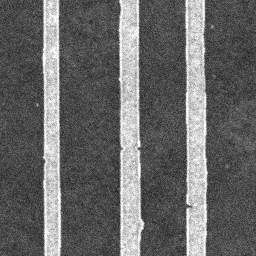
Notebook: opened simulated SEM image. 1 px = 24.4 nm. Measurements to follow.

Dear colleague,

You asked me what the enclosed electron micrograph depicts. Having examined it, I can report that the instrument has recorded one or a few lines or trenches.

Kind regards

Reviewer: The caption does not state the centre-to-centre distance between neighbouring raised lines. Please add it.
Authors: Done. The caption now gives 1760 nm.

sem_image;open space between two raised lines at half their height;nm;1390